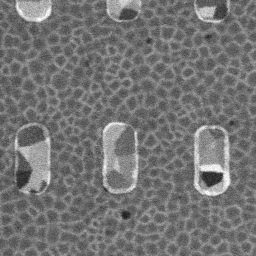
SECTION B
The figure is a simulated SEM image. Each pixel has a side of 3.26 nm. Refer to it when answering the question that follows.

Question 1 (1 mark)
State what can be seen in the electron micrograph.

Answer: raised bodies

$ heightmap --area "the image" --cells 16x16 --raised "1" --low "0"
0110000110001100
0000000000000000
0000000000000000
0000000000000000
0000000000000000
0000000000000000
0000000000000000
0000000000000000
0110001100001100
0110001110001100
0110001110001100
0110000100001100
0000000000000000
0000000000000000
0000000000000000
0000000000000000